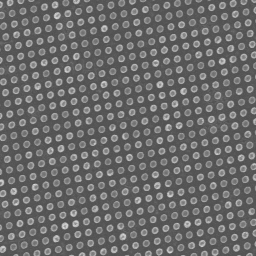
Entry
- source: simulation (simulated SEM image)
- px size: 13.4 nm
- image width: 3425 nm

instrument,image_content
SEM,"a regular array of raised bodies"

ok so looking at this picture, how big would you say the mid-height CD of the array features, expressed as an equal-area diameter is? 0.0867 microns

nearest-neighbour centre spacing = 144 nm